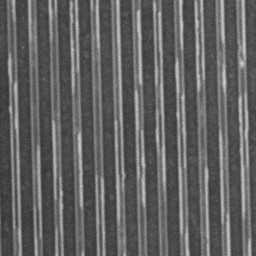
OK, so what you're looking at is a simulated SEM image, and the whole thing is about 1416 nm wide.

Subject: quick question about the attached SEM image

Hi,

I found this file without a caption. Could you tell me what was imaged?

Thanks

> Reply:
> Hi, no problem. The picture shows parallel lines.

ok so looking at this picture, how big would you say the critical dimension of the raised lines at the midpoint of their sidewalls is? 39.4 nm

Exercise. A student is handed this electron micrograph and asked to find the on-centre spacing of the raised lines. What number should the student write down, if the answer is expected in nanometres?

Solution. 115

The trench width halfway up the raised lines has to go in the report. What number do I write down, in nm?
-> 73.2